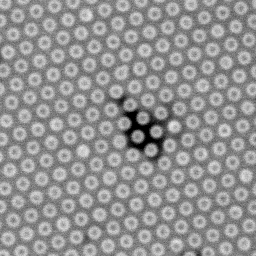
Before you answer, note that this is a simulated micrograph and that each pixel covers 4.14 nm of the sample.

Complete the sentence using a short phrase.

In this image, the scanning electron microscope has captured a regular array of raised bodies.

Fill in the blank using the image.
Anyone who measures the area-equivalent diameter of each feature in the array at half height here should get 0.0476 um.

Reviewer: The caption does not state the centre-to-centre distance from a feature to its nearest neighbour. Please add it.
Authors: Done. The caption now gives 77.3 nm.